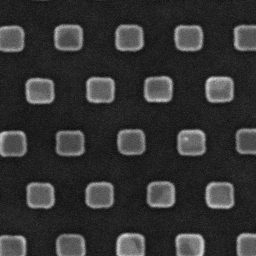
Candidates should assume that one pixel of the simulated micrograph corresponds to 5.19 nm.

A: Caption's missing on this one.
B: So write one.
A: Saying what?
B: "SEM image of a regular array of raised bodies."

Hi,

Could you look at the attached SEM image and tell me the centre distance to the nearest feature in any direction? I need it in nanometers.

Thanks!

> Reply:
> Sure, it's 310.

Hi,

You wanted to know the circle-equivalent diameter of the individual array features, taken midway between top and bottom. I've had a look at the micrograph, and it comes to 0.143 um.